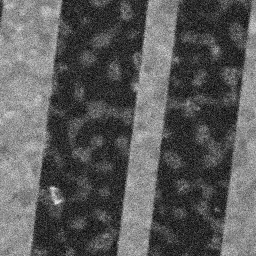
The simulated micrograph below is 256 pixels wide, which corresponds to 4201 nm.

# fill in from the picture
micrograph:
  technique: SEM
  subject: one or a few lines or trenches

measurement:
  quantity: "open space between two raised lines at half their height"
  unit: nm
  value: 1220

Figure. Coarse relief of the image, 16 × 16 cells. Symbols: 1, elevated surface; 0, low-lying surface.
1111000001100000
1111000001100000
1111000001100001
1110000001100001
1110000001100001
1110000001000001
1110000001000001
1110000011000001
1110000011000001
1110000011000001
1110000011000011
1100000011000011
1100000011000011
1100000010000011
1100000010000011
1100000110000011